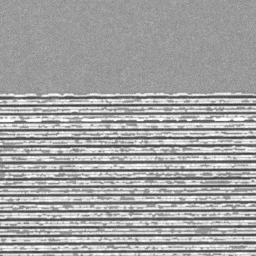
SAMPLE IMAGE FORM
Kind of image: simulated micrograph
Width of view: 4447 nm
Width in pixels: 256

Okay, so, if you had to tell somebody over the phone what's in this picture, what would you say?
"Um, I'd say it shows parallel lines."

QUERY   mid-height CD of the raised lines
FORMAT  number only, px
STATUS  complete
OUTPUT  4.75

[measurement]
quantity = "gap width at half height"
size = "49.9 nm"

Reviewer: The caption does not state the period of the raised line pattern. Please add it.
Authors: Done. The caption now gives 141 nm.